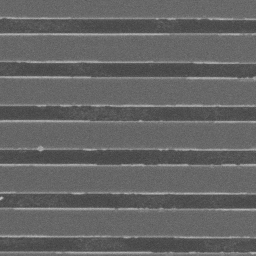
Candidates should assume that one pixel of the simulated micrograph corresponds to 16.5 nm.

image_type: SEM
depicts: lines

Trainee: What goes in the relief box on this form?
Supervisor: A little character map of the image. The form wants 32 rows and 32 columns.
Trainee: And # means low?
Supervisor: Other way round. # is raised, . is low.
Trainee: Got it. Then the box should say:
################################
################################
................................
................................
################################
################################
################################
################################
................................
................................
################################
################################
################################
................................
................................
################################
################################
################################
################################
................................
................................
################################
################################
################################
................................
................................
################################
################################
################################
################################
................................
................................